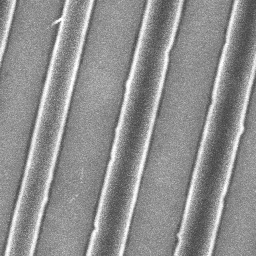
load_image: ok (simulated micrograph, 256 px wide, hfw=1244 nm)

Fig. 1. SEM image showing one or a few lines or trenches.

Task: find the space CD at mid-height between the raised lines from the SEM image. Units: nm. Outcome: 256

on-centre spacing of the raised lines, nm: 409